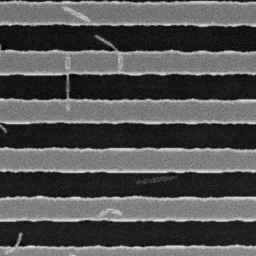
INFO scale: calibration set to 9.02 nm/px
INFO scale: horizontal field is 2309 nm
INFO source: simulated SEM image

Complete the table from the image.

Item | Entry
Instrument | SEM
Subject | lines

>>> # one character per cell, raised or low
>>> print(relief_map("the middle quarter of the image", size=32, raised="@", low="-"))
@@@@@@@@@@@@@@@@@@@@@@@@@@@@@@@@
@@@@@@@@@@@@@@@@@@@@@@@@@@@@@@@@
@@-@@--@@@@----@@@@@@--@@@---@@@
--------------------------------
--------------------------------
--------------------------------
--------------------------------
--------------------------------
--------------------------------
@@@@@@@@@@@@@@@@@@@@@@@@@@@@@@@@
@@@@@@@@@@@@@@@@@@@@@@@@@@@@@@@@
@@@@@@@@@@@@@@@@@@@@@@@@@@@@@@@@
@@@@@@@@@@@@@@@@@@@@@@@@@@@@@@@@
@@@@@@@@@@@@@@@@@@@@@@@@@@@@@@@@
@@@--@@@@@-@@@@---@@@@@@@@@@@@@@
--------------------------------
--------------------------------
--------------------------------
--------------------------------
--------------------------------
--------------------------------
@@@@@@@@@@@@@@@@@@@@@@@@@@@@@@@@
@@@@@@@@@@@@@@@@@@@@@@@@@@@@@@@@
@@@@@@@@@@@@@@@@@@@@@@@@@@@@@@@@
@@@@@@@@@@@@@@@@@@@@@@@@@@@@@@@@
@@@@@@@@@@@@@@@@@@@@@@@@@@@@@@@@
@@@@@@@@@@@@@@@@@@@@@@@@@@@@@@@@
--------------------------------
--------------------------------
--------------------------------
--------------------------------
--------------------------------